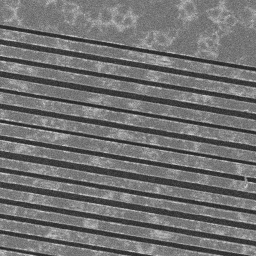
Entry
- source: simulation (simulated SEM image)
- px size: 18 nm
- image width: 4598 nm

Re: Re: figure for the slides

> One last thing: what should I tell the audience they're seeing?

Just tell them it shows parallel lines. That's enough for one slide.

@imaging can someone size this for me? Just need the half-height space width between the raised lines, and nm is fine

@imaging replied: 86.3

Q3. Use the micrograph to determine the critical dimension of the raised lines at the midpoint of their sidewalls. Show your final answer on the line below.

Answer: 186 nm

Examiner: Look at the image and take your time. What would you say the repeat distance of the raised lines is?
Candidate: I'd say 0.281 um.